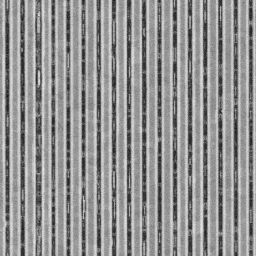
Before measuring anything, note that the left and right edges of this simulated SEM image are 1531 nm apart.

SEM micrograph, parallel lines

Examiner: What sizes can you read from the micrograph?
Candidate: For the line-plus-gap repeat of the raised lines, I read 91.1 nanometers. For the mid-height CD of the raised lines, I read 50.9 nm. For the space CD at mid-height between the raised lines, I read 38.9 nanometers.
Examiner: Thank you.